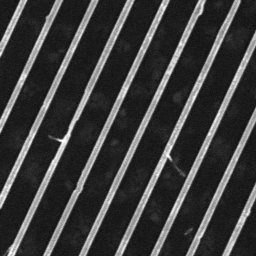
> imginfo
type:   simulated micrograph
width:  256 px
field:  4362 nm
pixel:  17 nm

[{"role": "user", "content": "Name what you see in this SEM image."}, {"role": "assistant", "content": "parallel lines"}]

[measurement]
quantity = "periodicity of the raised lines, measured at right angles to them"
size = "551 nanometres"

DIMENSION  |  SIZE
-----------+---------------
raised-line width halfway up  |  96.4 nm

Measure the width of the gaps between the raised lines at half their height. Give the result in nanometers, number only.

457